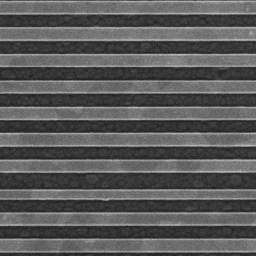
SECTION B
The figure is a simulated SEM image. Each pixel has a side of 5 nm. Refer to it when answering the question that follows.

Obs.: parallel lines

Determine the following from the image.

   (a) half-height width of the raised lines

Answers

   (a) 0.0593 microns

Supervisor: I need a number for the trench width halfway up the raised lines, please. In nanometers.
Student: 72.4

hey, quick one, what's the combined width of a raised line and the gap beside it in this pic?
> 132 nanometres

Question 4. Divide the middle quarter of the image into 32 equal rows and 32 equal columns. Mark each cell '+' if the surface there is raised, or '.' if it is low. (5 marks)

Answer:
................................
................................
................................
................................
++++++++++++++++++++++++++++++++
++++++++++++++++++++++++++++++++
++++++++++++++++++++++++++++++++
................................
................................
................................
................................
++++++++++++++++++++++++++++++++
++++++++++++++++++++++++++++++++
++++++++++++++++++++++++++++++++
................................
................................
................................
++++++++++++++++++++++++++++++++
++++++++++++++++++++++++++++++++
++++++++++++++++++++++++++++++++
................................
................................
................................
................................
++++++++++++++++++++++++++++++++
++++++++++++++++++++++++++++++++
++++++++++++++++++++++++++++++++
................................
......++........................
................................
................................
................................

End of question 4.